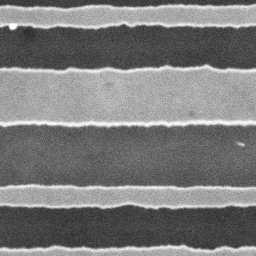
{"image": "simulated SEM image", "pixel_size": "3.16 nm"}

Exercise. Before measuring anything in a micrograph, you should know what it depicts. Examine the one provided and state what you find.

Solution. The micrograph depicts lines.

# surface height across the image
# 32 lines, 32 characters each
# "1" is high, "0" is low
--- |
00000000000000000000000000000000
11111111111111111111111111111111
11111111111111111111111111111111
01000000000100000000000000000000
00000000000000000000000000000000
00000000000000000000000000000000
00000000000000000000000000000000
00000000000000000000000000000000
00000000000000000000110011100000
11111111111111111111111111111111
11111111111111111111111111111111
11111111111111111111111111111111
11111111111111111111111111111111
11111111111111111111111111111111
11111111111111111111111111111111
11000011111111111111111100001010
00000000000000000000000000000000
00000000000000000000000000000000
00000000000000000000000000000000
00000000000000000000000000000000
00000000000000000000000000000000
00000000000000000000000000000000
00000000000000000000000000000000
11111111111111111111111111111101
11111111111111111111111111111111
11111111111111111111111111111111
00000000000000000000000000000000
00000000000000000000000000000000
00000000000000000000000000000000
00000000000000000000000000000000
00000000000000000000000000000000
11111111111111111111111111111111